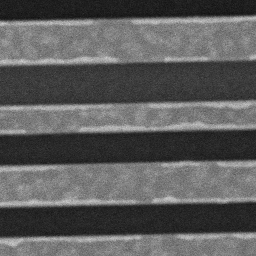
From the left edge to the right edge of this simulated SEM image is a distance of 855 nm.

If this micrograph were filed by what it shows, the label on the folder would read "one or a few lines or trenches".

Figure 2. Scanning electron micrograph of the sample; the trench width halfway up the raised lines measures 30 pixels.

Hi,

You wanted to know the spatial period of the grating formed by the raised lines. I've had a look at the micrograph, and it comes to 240 nm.